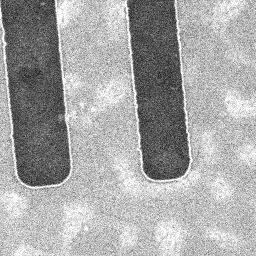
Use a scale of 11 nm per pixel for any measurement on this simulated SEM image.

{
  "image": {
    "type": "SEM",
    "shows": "one or a few lines or trenches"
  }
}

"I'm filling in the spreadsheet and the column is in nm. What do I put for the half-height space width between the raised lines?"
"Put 766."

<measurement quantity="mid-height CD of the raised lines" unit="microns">0.553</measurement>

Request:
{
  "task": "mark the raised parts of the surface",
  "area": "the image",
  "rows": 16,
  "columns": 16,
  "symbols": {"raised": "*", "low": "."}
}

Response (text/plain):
****....***.....
****....***.....
****....***.....
****....***.....
****....***.....
****....***.....
.***....****....
.***.....***....
.***.....***....
.***.....***....
.***.....***....
..**............
................
................
................
................